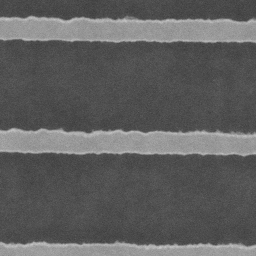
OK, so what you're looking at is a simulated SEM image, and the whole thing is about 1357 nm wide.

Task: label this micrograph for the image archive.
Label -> lines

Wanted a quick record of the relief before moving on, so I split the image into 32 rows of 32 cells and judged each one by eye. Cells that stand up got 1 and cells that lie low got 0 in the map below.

00000000000000000000000000000000
00000000000000000000000000000000
11111111011111110000010111011000
11111111111111111111111111111111
11111111111111111111111111111111
00000000000000000000000000000000
00000000000000000000000000000000
00000000000000000000000000000000
00000000000000000000000000000000
00000000000000000000000000000000
00000000000000000000000000000000
00000000000000000000000000000000
00000000000000000000000000000000
00000000000000000000000000000000
00000000000000000000000000000000
00000000000000000000000000000000
11111111000010111101100010000000
11111111111111111111111111111111
11111111111111111111111111111111
00000000000000000000000000000000
00000000000000000000000000000000
00000000000000000000000000000000
00000000000000000000000000000000
00000000000000000000000000000000
00000000000000000000000000000000
00000000000000000000000000000000
00000000000000000000000000000000
00000000000000000000000000000000
00000000000000000000000000000000
00000000000000000000000000000000
11111111111111111000000001000000
11111111111111111111111111111111